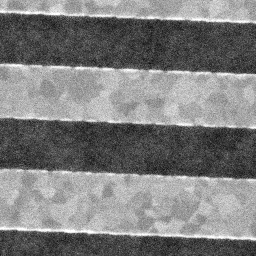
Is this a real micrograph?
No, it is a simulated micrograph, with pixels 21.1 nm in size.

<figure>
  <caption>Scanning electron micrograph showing lines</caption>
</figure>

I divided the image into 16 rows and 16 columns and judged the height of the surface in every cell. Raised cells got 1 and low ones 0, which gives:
1111111111111111
0000000000000000
0000000000000000
0000000000000000
1111111111110000
1111111111111111
1111111111111111
0000011111111111
0000000000000000
0000000000000000
0000000000000000
1111111111111111
1111111111111111
1111111111111111
0000001111111111
0000000000000000